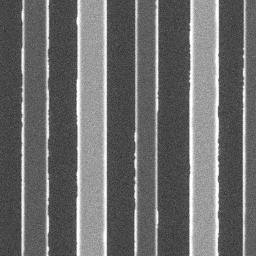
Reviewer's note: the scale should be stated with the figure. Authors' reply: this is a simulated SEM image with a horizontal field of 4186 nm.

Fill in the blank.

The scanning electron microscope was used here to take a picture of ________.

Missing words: lines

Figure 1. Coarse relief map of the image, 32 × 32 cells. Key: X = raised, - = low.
---XXX----XXX----XXX----XXX----X
---XXX----XXX----XXX----XXX----X
---XXX----XXX----XXX----XXX----X
---XXX----XXX----XXX----XXX----X
---XXX----XXX----XXX----XXX----X
---XXX----XXX----XXX----XXX----X
---XXX----XXX----XXX----XXX----X
---XXX----XXX----XXX----XXX----X
---XXX----XXX----XXX----XXX----X
---XXX----XXX----XXX----XXX---XX
---XXX----XXX----XXX----XXX----X
---XXX----XXX----XXX----XXX----X
---XXX----XXX----XXX----XXX---XX
---XXX----XXX----XXX----XXX---XX
---XXX----XXX----XXX----XXX---XX
---XXX----XXX----XXX----XXX---XX
---XXX----XXX----XXX----XXX---XX
---XXX----XXX----XXX----XXX---XX
---XXX----XXX----XXX----XXX---XX
---XXX----XXX----XXX----XXX---XX
---XXX----XXX----XXX----XXX---XX
---XXX----XXX----XXX----XXX---XX
---XXX----XXX----XXX----XXX---XX
---XXX----XXX----XXX----XXX---XX
---XXX----XXX----XXX----XXX---XX
---XXX----XXX----XXX----XXX---XX
---XXX----XXX----XXX----XXX---XX
---XXX----XXX----XXX----XXX---XX
---XXX----XXX----XXX----XXX---XX
---XXX----XXX----XXX----XXX---XX
---XXX----XXX----XXX----XXX---XX
---XXX----XXX----XXX----XXX---XX